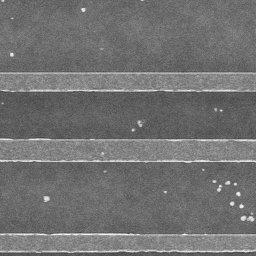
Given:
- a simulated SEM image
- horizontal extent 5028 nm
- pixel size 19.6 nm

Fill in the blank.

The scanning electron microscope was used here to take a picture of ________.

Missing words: lines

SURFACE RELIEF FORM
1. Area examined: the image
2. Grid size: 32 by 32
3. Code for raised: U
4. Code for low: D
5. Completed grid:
DDDDDDDDDDDDDDDDDDDDDDDDDDDDDDDD
DDDDDDDDDDDDDDDDDDDDDDDDDDDDDDDD
DDDDDDDDDDDDDDDDDDDDDDDDDDDDDDDD
DDDDDDDDDDDDDDDDDDDDDDDDDDDDDDDD
DDDDDDDDDDDDDDDDDDDDDDDDDDDDDDDD
DDDDDDDDDDDDDDDDDDDDDDDDDDDDDDDD
DDDDDDDDDDDDDDDDDDDDDDDDDDDDDDDD
DDDDDDDDDDDDDDDDDDDDDDDDDDDDDDDD
DDDDDDDDDDDDDDDDDDDDDDDDDDDDDDDD
UUUUUUUUUUUUUUUUUUUUUUUUUUUUUUUU
UUUUUUUUUUUUUUUUUUUUUUUUUUUUUUUU
DDDDDDDDDDDDDDDDDDDDDDDDDDDDDDDD
DDDDDDDDDDDDDDDDDDDDDDDDDDDDDDDD
DDDDDDDDDDDDDDDDDDDDDDDDDDDDDDDD
DDDDDDDDDDDDDDDDDDDDDDDDDDDDDDDD
DDDDDDDDDDDDDDDDDDDDDDDDDDDDDDDD
DDDDDDDDDDDDDDDDDDDDDDDDDDDDDDDD
UUDUUDDDDDDDDDDDDDDDDDDDDDDDDDDD
UUUUUUUUUUUUUUUUUUUUUUUUUUUUUUUU
UUUUUUUUUUUUUUUUUUUUUUUUUUUUUUUU
DDDDDDDDDDDDDDDDDDDDDDDDDDDDDDDD
DDDDDDDDDDDDDDDDDDDDDDDDDDDDDDDD
DDDDDDDDDDDDDDDDDDDDDDDDDDDDDDDD
DDDDDDDDDDDDDDDDDDDDDDDDDDDDDDDD
DDDDDDDDDDDDDDDDDDDDDDDDDDDDDDDD
DDDDDDDDDDDDDDDDDDDDDDDDDDDDDDDD
DDDDDDDDDDDDDDDDDDDDDDDDDDDDDDDD
DDDDDDDDDDDDDDDDDDDDDDDDDDDDDDDD
DDDDDDDDDDDDDDDDDDDDDDDDDDDDDDDD
UUUUUUUUUUUUUUUUUUUUUUUUUUUUUUUU
UUUUUUUUUUUUUUUUUUUUUUUUUUUUUUUU
DDDDUDDDUUDDDDDDDDDDDDDDDDDDDDDD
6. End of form